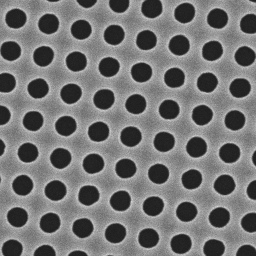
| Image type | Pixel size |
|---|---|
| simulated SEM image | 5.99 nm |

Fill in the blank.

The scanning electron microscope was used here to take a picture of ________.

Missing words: a regular array of holes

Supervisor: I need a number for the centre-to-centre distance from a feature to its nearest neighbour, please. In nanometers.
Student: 194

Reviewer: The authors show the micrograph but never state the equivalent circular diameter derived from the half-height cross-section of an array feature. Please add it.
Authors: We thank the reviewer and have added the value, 125 nm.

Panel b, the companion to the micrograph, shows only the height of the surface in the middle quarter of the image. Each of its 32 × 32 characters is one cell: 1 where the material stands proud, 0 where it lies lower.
10000111100000111000001111111111
11000111100000111000001111000111
11111111100001111000001110000011
11111111111111111000001110000011
11111111111111111100111110000011
00001111111111111111111111000111
00001111100111111111111111111111
00001111000011111101111111111111
00001110000001110000111111111111
00011110000001100000011110001111
11111111000011100000011100000111
11111111111111110000111100000111
11111111111111111001111100000111
00111111111111111111111110001111
00011111001111111111111111111111
00011100000111111111111111111111
00011100000111100001111111111111
00111100000111000001111000011111
11111100000111000001111000001111
11111111011111000001110000001110
11111111111111110011111000011110
01111111111111111111111000011110
00111110111111111111111111111110
00111000001111111111111111111111
00111000001110000111111111111111
01111000001110000011110001111111
11111000001110000011100000111110
11111111111110000011100000111100
11111111111111001111100000111000
11111111111111111111110001111000
11111001111111111111111111111100
01110000111111111111111111111111